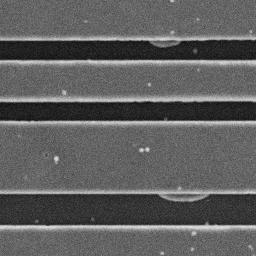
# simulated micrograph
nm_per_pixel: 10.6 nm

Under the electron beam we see lines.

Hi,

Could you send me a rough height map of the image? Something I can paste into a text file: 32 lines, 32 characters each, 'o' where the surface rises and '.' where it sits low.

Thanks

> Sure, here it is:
oooooooooooooooooooooooooooooooo
oooooooooooooooooooooooooooooooo
oooooooooooooooooooooooooooooooo
oooooooooooooooooooooooooooooooo
oooooooooooooooooooooooooooooooo
................................
................................
................................
oooooooooooooooooooooooooooooooo
oooooooooooooooooooooooooooooooo
oooooooooooooooooooooooooooooooo
oooooooooooooooooooooooooooooooo
oooooooooooooooooooooooooooooooo
................................
................................
oooooooooooooooooooooooooooooooo
oooooooooooooooooooooooooooooooo
oooooooooooooooooooooooooooooooo
oooooooooooooooooooooooooooooooo
oooooooooooooooooooooooooooooooo
oooooooooooooooooooooooooooooooo
oooooooooooooooooooooooooooooooo
oooooooooooooooooooooooooooooooo
oooooooooooooooooooooooooooooooo
................................
................................
................................
................................
oooooooooooooooooooooooooooooooo
oooooooooooooooooooooooooooooooo
oooooooooooooooooooooooooooooooo
oooooooooooooooooooooooooooooooo